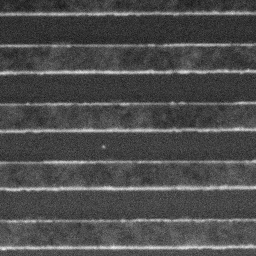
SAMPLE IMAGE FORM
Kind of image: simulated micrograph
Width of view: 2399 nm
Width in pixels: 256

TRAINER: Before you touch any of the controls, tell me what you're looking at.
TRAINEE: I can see lines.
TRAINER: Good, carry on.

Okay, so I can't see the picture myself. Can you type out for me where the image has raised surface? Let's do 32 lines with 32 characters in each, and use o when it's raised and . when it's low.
oooooooooooooooooooooooooooooooo
oooooooooooooooooooooooooooooooo
................................
................................
................................
................................
oooooooooooooooooooooooooooooooo
oooooooooooooooooooooooooooooooo
oooooooooooooooooooooooooooooooo
................................
................................
................................
................................
oooooooooooooooooooooooooooooooo
oooooooooooooooooooooooooooooooo
oooooooooooooooooooooooooooooooo
................................
................................
................................
................................
oooooooooooooooooooooooooooooooo
oooooooooooooooooooooooooooooooo
oooooooooooooooooooooooooooooooo
oooooooooooooooooooooo.oooooo.oo
................................
................................
................................
................................
oooooooooooooooooooooooooooooooo
oooooooooooooooooooooooooooooooo
oooooooooooooooooooooooooooooooo
................................